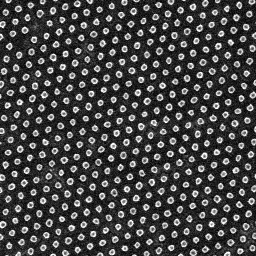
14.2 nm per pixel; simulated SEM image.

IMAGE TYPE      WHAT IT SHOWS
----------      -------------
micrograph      a regular array of raised bodies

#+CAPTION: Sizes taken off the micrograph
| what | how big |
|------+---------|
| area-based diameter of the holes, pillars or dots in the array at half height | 80.1 nanometers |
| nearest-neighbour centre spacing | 178 nm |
